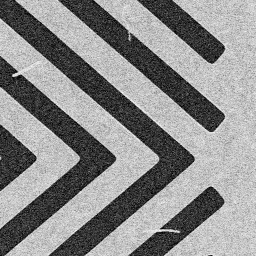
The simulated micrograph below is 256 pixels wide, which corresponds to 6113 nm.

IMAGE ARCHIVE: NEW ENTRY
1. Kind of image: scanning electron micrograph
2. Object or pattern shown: groups of lines, slits or small figures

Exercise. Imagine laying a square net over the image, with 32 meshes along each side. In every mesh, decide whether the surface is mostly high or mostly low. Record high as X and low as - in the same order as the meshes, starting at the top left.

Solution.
--XXXXXX----XXXXXX----XXXXXXXXXX
----XXXXX----XXXXXX----XXXXXXXXX
-----XXXXX-----XXXXX----XXXXXXXX
X-----XXXXX-----XXXXX-----XXXXXX
XX-----XXXXX-----XXXXX-----XXXXX
XXXX----XXXXX-----XXXXX-----XXXX
XXXXX----XXXXXX----XXXXX----XXXX
-XXXXX-----XXXXX----XXXXXX-XXXXX
--XXXXX-----XXXXX----XXXXXXXXXXX
---XXXXX-----XXXXX-----XXXXXXXXX
----XXXXX-----XXXXX-----XXXXXXXX
X----XXXXX-----XXXXX-----XXXXXXX
XX----XXXXXX----XXXXXX----XXXXXX
XXX-----XXXXX----XXXXXX----XXXXX
XXXX-----XXXXX-----XXXXX----XXXX
XXXXX-----XXXXX-----XXXXX---XXXX
-XXXXX-----XXXXX-----XXXXX-XXXXX
--XXXXXX----XXXXX-----XXXXXXXXXX
---XXXXXX----XXXXXX----XXXXXXXXX
----XXXXXX----XXXXXX----XXXXXXXX
----XXXXX-----XXXXX-----XXXXXXXX
---XXXXX-----XXXXX-----XXXXXXXXX
--XXXXX-----XXXXX-----XXXXXXXXXX
-XXXXX-----XXXXX-----XXXXX-XXXXX
XXXXX----XXXXXX----XXXXXX---XXXX
XXXX----XXXXXX----XXXXXX----XXXX
XX-----XXXXX-----XXXXX-----XXXXX
X-----XXXXX-----XXXXX-----XXXXXX
-----XXXXX-----XXXXX-----XXXXXXX
----XXXXX----XXXXXX----XXXXXXXXX
--XXXXXX----XXXXXX----XXXXXXXXXX
-XXXXX-----XXXXX-----XXXXXXXXXXX